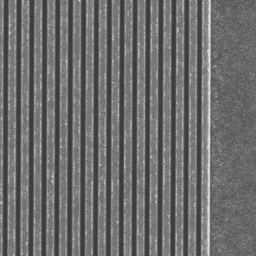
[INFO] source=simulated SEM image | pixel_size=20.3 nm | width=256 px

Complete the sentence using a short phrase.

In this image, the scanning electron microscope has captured parallel lines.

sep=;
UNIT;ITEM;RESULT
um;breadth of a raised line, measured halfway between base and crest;0.155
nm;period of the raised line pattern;262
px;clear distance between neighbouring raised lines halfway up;4.87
